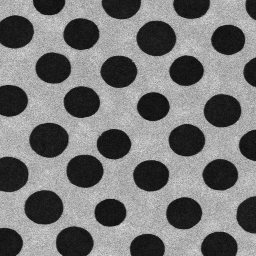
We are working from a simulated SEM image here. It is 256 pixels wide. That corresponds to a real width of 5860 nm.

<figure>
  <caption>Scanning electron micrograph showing a regular array of holes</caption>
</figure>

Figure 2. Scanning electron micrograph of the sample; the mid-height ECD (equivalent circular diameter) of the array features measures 0.771 um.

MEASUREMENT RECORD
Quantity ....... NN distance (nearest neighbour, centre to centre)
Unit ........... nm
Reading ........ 1070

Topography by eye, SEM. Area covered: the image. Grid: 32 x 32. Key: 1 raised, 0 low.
11110000111110000011110000111110
11111001111110000111110000111110
00001111100111111111111111111111
00001111000011111100011111100011
00001111000011111000001111100001
00011111000011111000001111100001
11111111111111111100011111100011
11111000011110001111110001111110
11110000011110000111100001111110
11111000011110000111100001111110
11111111111110001111110011111110
00011111100011111111111111111111
00011111000011111000011111000011
00011111000011111000011111000011
10111111100111111100011111000011
11111001111111111111111111000111
11110000111110011111100001111110
11110000011100001111100000111100
11110000111100001111100001111100
11111001110010001111111011111100
00011111100001111000111111000111
00011111000001111000011110000011
00011111100011111000011110000011
00011111111111111100111111000111
11110001111111111111111111111111
11100000111100011111100001111100
11100000111100001111100001111100
11110001111100011111100001111100
11111111001111111111110011111100
00011110000111111000111111000111
00011110000011110000111110000011
00111110000111110000011110000011